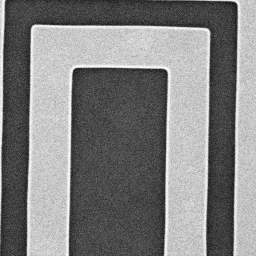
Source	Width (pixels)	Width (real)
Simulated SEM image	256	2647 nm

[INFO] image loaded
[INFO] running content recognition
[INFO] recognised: groups of lines, slits or small figures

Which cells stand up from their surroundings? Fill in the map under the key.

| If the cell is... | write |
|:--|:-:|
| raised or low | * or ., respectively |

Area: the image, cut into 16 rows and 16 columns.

...............*
...............*
..***********..*
..***********..*
..***.....***..*
..**.......**..*
..**.......**..*
..**......***..*
..**......***..*
..**......***..*
..**......***..*
..**......***..*
..**......***..*
..**......***..*
..**......***..*
..**......***..*